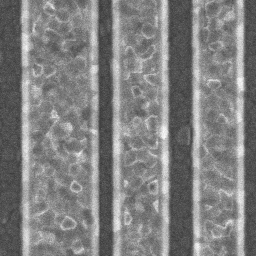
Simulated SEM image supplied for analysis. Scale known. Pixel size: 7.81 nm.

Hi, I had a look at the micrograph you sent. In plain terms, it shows one or a few lines or trenches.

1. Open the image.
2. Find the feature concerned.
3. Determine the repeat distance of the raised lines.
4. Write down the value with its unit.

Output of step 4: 618 nm